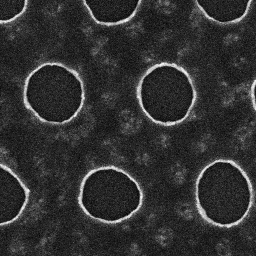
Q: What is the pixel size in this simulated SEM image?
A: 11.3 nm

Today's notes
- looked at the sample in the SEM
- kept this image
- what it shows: holes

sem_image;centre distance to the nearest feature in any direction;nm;1280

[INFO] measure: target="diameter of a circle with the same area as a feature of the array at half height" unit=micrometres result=0.631